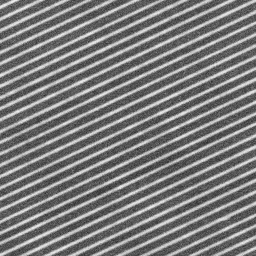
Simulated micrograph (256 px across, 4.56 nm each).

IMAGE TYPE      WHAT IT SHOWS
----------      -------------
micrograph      parallel lines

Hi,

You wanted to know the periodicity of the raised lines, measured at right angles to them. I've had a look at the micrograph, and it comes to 46.4 nm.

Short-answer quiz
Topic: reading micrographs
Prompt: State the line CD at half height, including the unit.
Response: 11.9 nm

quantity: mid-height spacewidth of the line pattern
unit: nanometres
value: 35.6